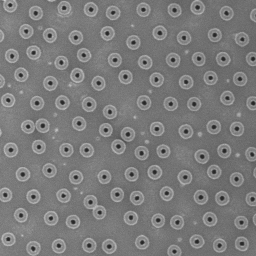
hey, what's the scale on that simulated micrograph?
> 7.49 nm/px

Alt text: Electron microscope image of a regular array of ring-shaped raised bodies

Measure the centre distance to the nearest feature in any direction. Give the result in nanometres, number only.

165